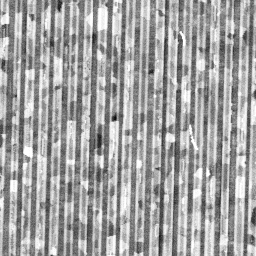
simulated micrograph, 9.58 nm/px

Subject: parallel lines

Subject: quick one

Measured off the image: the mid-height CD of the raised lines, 6.75 px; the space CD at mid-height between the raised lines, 71.8 nanometres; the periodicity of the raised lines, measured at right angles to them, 136 nm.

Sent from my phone